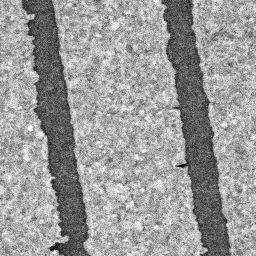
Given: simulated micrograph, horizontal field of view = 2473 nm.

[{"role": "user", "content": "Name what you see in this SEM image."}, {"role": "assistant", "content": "one or a few lines or trenches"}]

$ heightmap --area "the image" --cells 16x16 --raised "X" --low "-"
X---XXXXXX--XXXX
XX--XXXXXX--XXXX
XX--XXXXXX--XXXX
XX--XXXXXX---XXX
XX--XXXXXXX--XXX
XX--XXXXXXX--XXX
XX--XXXXXXX--XXX
XX---XXXXXX--XXX
XXX--XXXXXX--XXX
XXX--XXXXXX---XX
XXX--XXXXXX---XX
XXX--XXXXXXX--XX
XXX--XXXXXXX--XX
XXXX--XXXXXX--XX
XXXX--XXXXXX--XX
XXX---XXXXXXX-XX